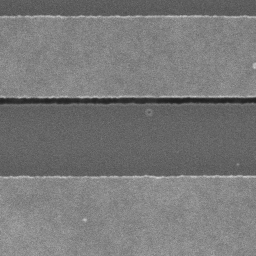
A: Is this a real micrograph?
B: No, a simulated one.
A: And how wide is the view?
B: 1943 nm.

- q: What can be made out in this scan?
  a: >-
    lines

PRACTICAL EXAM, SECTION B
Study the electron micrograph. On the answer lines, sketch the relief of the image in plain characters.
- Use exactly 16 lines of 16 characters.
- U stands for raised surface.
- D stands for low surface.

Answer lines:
DDDDDDDDDDDDDDDD
UUUUUUUUUUUUUUUU
UUUUUUUUUUUUUUUU
UUUUUUUUUUUUUUUU
UUUUUUUUUUUUUUUU
UUUUUUUUUUUUUUUU
DDDDDDDDDDDDDDDD
DDDDDDDDDDDDDDDD
DDDDDDDDDDDDDDDD
DDDDDDDDDDDDDDDD
DDDDDDDDDDDDDDDD
UUUUUUUUUUUUUUUU
UUUUUUUUUUUUUUUU
UUUUUUUUUUUUUUUU
UUUUUUUUUUUUUUUU
UUUUUUUUUUUUUUUU